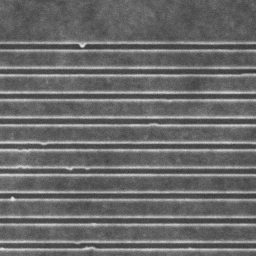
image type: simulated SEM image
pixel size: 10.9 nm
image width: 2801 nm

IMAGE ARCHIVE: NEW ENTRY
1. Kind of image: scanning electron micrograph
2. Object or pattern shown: parallel lines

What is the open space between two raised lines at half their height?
72.5 nm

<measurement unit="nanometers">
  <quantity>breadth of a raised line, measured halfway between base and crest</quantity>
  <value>196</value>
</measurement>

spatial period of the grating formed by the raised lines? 272 nm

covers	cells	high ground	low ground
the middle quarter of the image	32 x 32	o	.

oooooooooooooooooooooooooooooooo
................................
................................
oooooooooooooooooooooooooooooooo
oooooooooooooooooooooooooooooooo
oooooooooooooooooooooooooooooooo
oooooooooooooooooooooooooooooooo
................................
................................
oooooooooooooooooooooooooooooooo
oooooooooooooooooooooooooooooooo
oooooooooooooooooooooooooooooooo
oooooooooooooooooooooooooooooooo
................................
................................
oooooooooooooooooooooooooooooooo
oooooooooooooooooooooooooooooooo
oooooooooooooooooooooooooooooooo
oooooooooooooooooooooooooooooooo
oooooooooooooooooooooooooooooooo
................................
................................
oooooooooooooooooooooooooooooooo
oooooooooooooooooooooooooooooooo
oooooooooooooooooooooooooooooooo
oooooooooooooooooooooooooooooooo
................................
................................
oooooooooooooooooooooooooooooooo
oooooooooooooooooooooooooooooooo
oooooooooooooooooooooooooooooooo
oooooooooooooooooooooooooooooooo